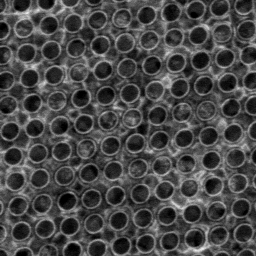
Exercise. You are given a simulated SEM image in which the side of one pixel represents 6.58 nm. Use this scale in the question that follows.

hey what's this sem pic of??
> a regular array of raised bodies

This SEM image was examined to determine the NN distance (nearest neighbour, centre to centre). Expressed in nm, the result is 160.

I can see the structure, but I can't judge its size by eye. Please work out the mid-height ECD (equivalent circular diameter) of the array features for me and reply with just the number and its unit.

123 nanometres